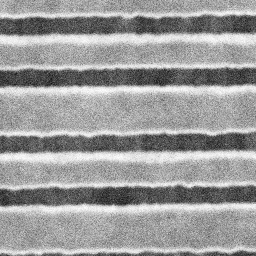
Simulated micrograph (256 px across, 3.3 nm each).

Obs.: lines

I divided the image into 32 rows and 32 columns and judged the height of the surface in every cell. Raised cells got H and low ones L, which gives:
HHHHHHHHHHHHHHHHHHHHHHHHHHHHHHHH
HHHHHHHHHHHHHHHHHHHHHHHHHHHHHHHH
LLLLLLLLLLLLLLLLLLLLLLLLLLLLLLLL
LLLLLLLLLLLLLLLLLLLLLLLLLLLLLLLL
LLLLLLLLLLLLLLLLLLLLLLLLLHLLHLLL
HHHHHHHHHHHHHHHHHHHHHHHHHHHHHHHH
HHHHHHHHHHHHHHHHHHHHHHHHHHHHHHHH
HHHHHHHHHHHHHHHHHHHHHHHHHHHHHHHH
HHHHHHHHHHHHHHLLLLLLLLLLLLLLLLLL
LLLLLLLLLLLLLLLLLLLLLLLLLLLLLLLL
LLLLLLLLLLLLLLLLLLLLLLLLLLLLLLLL
HHHHHHHHHHHHHHHHHHHHHHHHHHHHHHHH
HHHHHHHHHHHHHHHHHHHHHHHHHHHHHHHH
HHHHHHHHHHHHHHHHHHHHHHHHHHHHHHHH
HHHHHHHHHHHHHHHHHHHHHHHHHHHHHHHH
HHHHHHHHHHHHHHHHHHHHHHHHHHHHHHHH
HHHHHHHHHHHHHHHHHHHHHHHHHHHHHLHL
LLLLLLLLLLLLLLLLLLLLLLLLLLLLLLLL
LLLLLLLLLLLLLLLLLLLLLLLLLLLLLLLL
HHHHHHHHHHHHHHHHHHHHHHHHHHHHHHHH
HHHHHHHHHHHHHHHHHHHHHHHHHHHHHHHH
HHHHHHHHHHHHHHHHHHHHHHHHHHHHHHHH
HHHHHHHHHHHHHHHHHHHHHHHHHHHHHHHH
LHHLLLLLLLLLLLLLLLLLLLLLLLLLLLLL
LLLLLLLLLLLLLLLLLLLLLLLLLLLLLLLL
LLLLLLLLLLLLLLLLLLLLLLLLLLLLLLHL
HHHHHHHHHHHHHHHHHHHHHHHHHHHHHHHH
HHHHHHHHHHHHHHHHHHHHHHHHHHHHHHHH
HHHHHHHHHHHHHHHHHHHHHHHHHHHHHHHH
HHHHHHHHHHHHHHHHHHHHHHHHHHHHHHHH
HHHHHHHHHHHHHHHHHHHHHHHHHHHHHHHH
HHHHHHLLHHLHLLLLHLLLLLLLHLLLLLLL